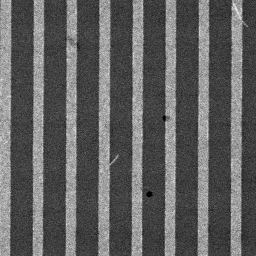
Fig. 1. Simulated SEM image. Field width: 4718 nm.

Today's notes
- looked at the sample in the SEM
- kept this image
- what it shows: parallel lines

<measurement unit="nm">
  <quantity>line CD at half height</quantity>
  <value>177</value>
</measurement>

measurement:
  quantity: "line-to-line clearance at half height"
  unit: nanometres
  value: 426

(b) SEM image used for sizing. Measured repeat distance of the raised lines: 608 nanometres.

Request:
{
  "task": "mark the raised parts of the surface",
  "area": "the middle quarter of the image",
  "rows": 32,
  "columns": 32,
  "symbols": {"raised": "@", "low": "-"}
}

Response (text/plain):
-@@------@@------@@-------@@----
-@@------@@------@@-------@@----
-@@------@@------@@-------@@----
-@@------@@------@@-------@@----
-@@------@@------@@-------@@----
-@@------@@------@@-------@@----
-@@------@@------@@-------@@----
-@@------@@------@@------@@@----
-@@------@@------@@-------@@----
-@@------@@------@@-------@@----
-@@------@@------@@------@@@----
-@@------@@------@@-------@@----
-@@------@@------@@-------@@----
-@@------@@------@@-------@@----
-@@------@@------@@-------@@----
-@@------@@------@@-------@@----
-@@------@@------@@-------@@----
-@@------@@------@@------@@@----
-@@------@@------@@-------@@----
-@@------@@------@@-------@@----
-@@------@@------@@-------@@----
-@@------@@------@@-------@@----
-@@------@@------@@-------@@----
-@@------@@------@@-------@@----
-@@------@@------@@-------@@----
-@@------@@------@@-------@@----
-@@------@@------@@-------@@----
-@@------@@------@@------@@@----
-@@------@@------@@-------@@----
-@@------@@------@@-------@@----
-@@------@@------@@-------@@----
-@@------@@------@@-------@@----